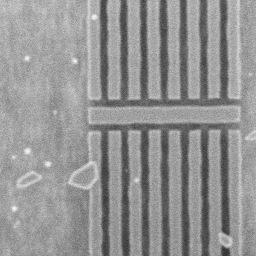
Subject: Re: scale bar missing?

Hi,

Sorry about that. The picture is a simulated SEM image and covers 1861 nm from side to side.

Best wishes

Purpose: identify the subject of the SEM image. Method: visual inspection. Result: groups of lines, slits or small figures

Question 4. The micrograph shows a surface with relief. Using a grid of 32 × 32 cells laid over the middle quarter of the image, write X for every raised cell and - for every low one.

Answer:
------XXX--XXX--XXX--XXX--XXX--X
------XXX--XXX--XXX--XXX--XXX--X
------XXX--XXX--XXX--XXX--XXX--X
------XXX--XXX--XXX--XXX--XXX--X
------XXX--XXX--XXX--XXX--XXX--X
------XXX--XXX--XXX--XXX--XXX--X
------XXX--XXX--XXX--XXX--XXX--X
------XXX--XXX--XXX--XXX--XXX--X
------XXX--XXX--XXX--XXX--XXX--X
--------------------------------
--------------------------------
------XXXXXXXXXXXXXXXXXXXXXXXXXX
------XXXXXXXXXXXXXXXXXXXXXXXXXX
------XXXXXXXXXXXXXXXXXXXXXXXXXX
------XXXXXXXXXXXXXXXXXXXXXXX---
--------------------------------
--------------------------------
------XXX--XXX--XXX--XXX--XXX---
------XXX--XXX--XXX--XXX--XXX---
------XXX--XXX--XXX--XXX--XXX---
------XXX--XXX--XXX--XXX--XXX--X
------XXX--XXX--XXX--XXX--XXX--X
-------XX--XXX--XXX--XXX--XXX--X
------XXX--XXX--XXX--XXX--XXX--X
------XXX--XXX---XX--XXX--XXX--X
-----XXXX--XXX---XX--XXX--XXX--X
----XXXXX---XX---XX---XX--XXX--X
--XXXXXXX---XX---XX--XXX--XXX--X
--XXXXXXX---XX---XX--XXX--XXX--X
-XXXXXXXX--XXX---XX--XXX--XXX--X
---XXXXXX--XXX---XX---XX---XX--X
-------XX--XXX--XXX---XX--XXX--X